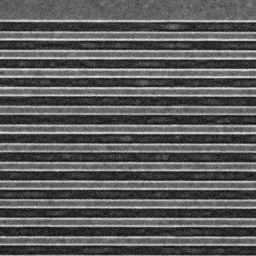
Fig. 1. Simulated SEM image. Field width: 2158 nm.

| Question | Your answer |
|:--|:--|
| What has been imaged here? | parallel lines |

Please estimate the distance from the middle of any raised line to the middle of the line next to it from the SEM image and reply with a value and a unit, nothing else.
157 nanometres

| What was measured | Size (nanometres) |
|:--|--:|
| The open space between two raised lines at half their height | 89.6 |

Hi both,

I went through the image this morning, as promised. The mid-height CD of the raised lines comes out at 0.0674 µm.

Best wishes